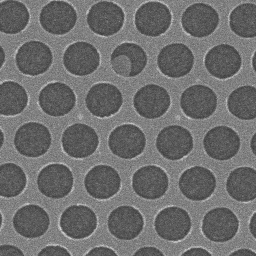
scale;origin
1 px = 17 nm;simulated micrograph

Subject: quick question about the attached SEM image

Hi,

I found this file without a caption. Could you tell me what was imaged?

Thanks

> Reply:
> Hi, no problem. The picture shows a regular array of holes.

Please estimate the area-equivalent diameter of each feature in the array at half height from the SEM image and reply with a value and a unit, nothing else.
614 nm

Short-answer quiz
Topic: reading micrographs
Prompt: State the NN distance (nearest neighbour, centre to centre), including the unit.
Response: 798 nm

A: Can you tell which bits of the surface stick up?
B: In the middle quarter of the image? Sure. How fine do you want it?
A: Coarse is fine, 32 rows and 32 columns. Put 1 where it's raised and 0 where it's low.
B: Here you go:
00000000011100000000011000000000
10000000111100000000111100000000
11000011111110000001111110000001
11111111111111101111111111110111
11111111111111111111111111111111
01111110000001111111000011111111
00111100000000111110000000111100
00011100000000111100000000111000
00011000000000011000000000011000
00011000000000011000000000011000
00011100000000111000000000111000
00111100000000111100000000111000
01111110000001111110000001111100
11111111111111111111000111111111
11111111111111111111111111111111
10000011111111000011111111000111
00000000111100000001111100000001
00000000111100000000111100000000
00000000011000000000111000000000
00000000011000000000011000000000
00000000111000000000111000000000
00000000111000000000111000000000
10000001111110000001111100000001
11100111111111000111111110000111
11111111111111111111111111111111
11111111000011111111000111111111
00111100000001111100000001111100
00111100000000111000000001111000
00111000000000111000000000111000
00111000000000111000000000111000
00111000000000111000000000111000
00111000000000111000000000111000